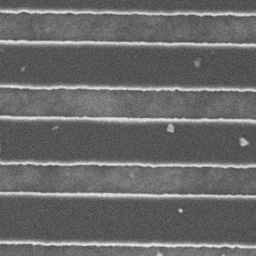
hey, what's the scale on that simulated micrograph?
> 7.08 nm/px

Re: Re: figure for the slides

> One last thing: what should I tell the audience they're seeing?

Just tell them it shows lines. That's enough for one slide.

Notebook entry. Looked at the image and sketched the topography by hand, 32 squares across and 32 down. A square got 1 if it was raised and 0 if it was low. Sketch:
11111111111111111111111111111111
11111111111111111111111111111111
00000000000000000000000000000000
00000000000000000000000000000000
00000000000000000000000000000000
11111111111111111111111111000000
11111111111111111111111111111111
11111111111111111111111111111111
11111111111111111111111111111111
11111111111111111111111111111111
11111111111111111111111111111111
00000000000000000000000000000000
00000000000000000000000000000000
00000000000000000000000000000000
00000000000000000000000000000000
11111111111111111111111111111111
11111111111111111111111111111111
11111111111111111111111111111111
11111111111111111111111111111111
11111111111111111111111111111111
11111111111111111111111111111111
00000000000000000000000000000000
00000000000000000000000000000000
00000000000000000000000000000000
11111111111111111111111111111100
11111111111111111111111111111111
11111111111111111111111111111111
11111111111111111111111111111111
11111111111111111111111111111111
11111111111111111111111111111111
00101111111111111111111111111111
00000000000000000000000000000000